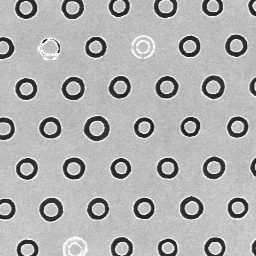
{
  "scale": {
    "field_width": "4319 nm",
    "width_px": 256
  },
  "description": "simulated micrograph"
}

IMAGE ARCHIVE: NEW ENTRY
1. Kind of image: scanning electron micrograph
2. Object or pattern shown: a regular array of ring-shaped grooves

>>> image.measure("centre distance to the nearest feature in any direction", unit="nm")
774